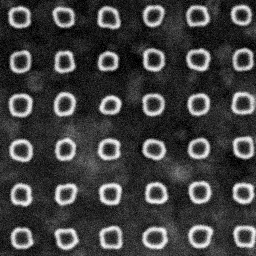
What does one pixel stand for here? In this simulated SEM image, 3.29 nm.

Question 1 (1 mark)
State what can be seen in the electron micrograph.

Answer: a regular array of raised bodies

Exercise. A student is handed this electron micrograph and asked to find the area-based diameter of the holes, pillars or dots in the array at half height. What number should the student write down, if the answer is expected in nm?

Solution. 68.8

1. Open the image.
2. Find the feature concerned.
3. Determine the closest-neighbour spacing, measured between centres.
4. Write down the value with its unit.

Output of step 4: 0.144 um